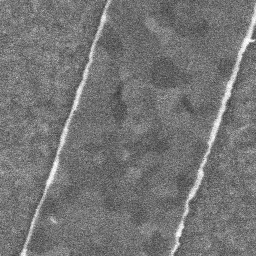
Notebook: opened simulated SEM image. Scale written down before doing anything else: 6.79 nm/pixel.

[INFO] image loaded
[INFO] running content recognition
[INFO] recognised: one or a few lines or trenches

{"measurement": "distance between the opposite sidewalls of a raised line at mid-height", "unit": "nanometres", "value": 973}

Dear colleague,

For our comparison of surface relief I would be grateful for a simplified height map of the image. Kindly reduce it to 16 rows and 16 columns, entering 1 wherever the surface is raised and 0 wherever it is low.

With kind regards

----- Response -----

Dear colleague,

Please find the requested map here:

0000000111111111
0000001111111111
0000001111111111
0000001111111110
0000011111111110
0000011111111100
0000011111111100
0000111111111100
0000111111111000
0000111111111000
0001111111111000
0001111111110000
0001111111110000
0011111111110000
0011111111100000
0111111111100000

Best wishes